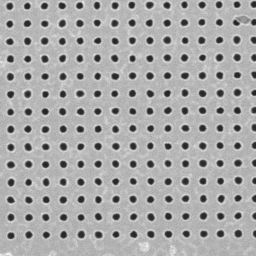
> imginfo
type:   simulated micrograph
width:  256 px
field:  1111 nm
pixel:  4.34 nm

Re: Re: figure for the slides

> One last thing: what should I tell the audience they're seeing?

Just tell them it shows a regular array of holes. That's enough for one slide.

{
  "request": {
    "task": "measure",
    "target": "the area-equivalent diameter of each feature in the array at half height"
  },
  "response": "30.6 nanometres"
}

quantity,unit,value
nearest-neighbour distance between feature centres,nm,74.5